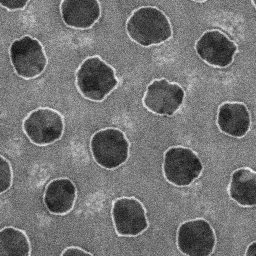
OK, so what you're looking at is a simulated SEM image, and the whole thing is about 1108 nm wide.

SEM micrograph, a regular array of raised bodies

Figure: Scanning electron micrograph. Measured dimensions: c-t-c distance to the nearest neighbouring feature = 304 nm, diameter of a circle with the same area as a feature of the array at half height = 168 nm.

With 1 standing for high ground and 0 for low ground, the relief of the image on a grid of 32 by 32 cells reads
11100000111100000000000000000000
00000000111110000111000000000000
00000000111100001111100000000000
00000000011000001111100000000000
00010000000000001111100001110000
01111000000000000111000011111000
01111100000000000000000001111000
01111100000110000000000001111000
00111100001111000000000000000000
00111000001111000000000000000000
00000000001111100001110000000000
00000000001111000011111000000000
00000000000110000011111000000000
00000100000000000011110000011110
00011111000000000000000000011110
00011111000000000000000000011110
00011111000011100000000000001110
00001110000111110000000000000000
00000000000111110000011000000000
00000000000011110000011110000000
10000000000011100000111110000000
10000000000000000000111110000111
10000001100000000000011100000111
10000011100000000000000000000111
00000111100000000000000000000111
00000011100000111100000000000011
00000011000000111100000000000000
00000000000000111100000011000000
01000000000000111100001111000000
11100000000000000000001111100000
11110000000000000000001111100001
11110000111000000000000111100001